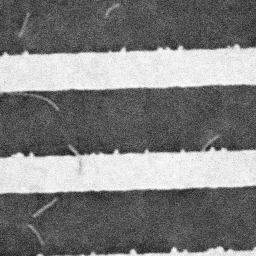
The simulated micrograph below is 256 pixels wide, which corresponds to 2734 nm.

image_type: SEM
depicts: lines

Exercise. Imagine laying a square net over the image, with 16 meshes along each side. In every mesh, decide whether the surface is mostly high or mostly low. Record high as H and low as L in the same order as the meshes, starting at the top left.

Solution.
LLLLLLLLLLLLLLLL
LLLLLLLLLLLLLLLL
LLLLLLLLLLLLLLLL
HHHHHHHHHHHHHHHH
HHHHHHHHHHHHHHHH
HHHHHHHLLLLLLLLL
LLLLLLLLLLLLLLLL
LLLLLLLLLLLLLLLL
LLLLLLLLLLLLLLLL
LLLLLLLLLLLLHHHH
HHHHHHHHHHHHHHHH
HHHHHHHHHHHHHHHH
LLLLLLLLLLLLLLLL
LLLLLLLLLLLLLLLL
LLLLLLLLLLLLLLLL
LLLLLLLLLLLLLLLL